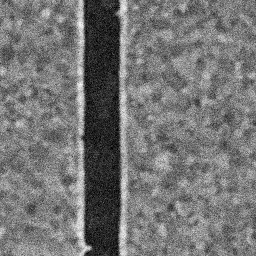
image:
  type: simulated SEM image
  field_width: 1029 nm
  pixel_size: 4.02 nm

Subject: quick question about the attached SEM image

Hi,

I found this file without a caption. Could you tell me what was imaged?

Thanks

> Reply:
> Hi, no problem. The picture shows one or a few lines or trenches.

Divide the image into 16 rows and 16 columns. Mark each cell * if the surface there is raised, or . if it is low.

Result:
*****...********
*****...********
*****...********
*****...********
*****...********
*****...********
*****...********
*****...********
*****...********
*****...********
*****...********
*****...********
*****...********
*****...********
*****...********
*****...********